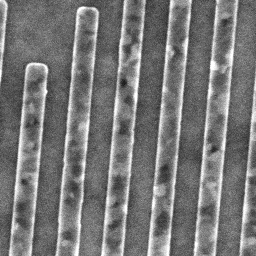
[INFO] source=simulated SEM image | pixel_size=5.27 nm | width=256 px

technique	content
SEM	parallel lines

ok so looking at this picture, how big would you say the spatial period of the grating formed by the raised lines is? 45.9 pixels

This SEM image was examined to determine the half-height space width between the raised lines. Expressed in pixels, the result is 25.2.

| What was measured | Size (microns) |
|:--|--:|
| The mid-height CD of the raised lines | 0.11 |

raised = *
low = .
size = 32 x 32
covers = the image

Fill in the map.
*...............**...***...***..
*.........**...***...***...***..
*.........**...***...***...**...
*.........**...***...***...**...
*........***...***...***...**...
.........***...***...**....**...
.........***...***...**....**...
.........***...**....**...***...
...***...***...**....**...***...
...***...***...**....**...***...
...***...***...**...***...***...
...***...**....**...***...***...
...***...**...***...***...***...
...**....**...***...***...**....
...**....**...***...***...**....
...**...***...***...**....**...*
...**...***...***...**....**...*
..***...***...***...**....**...*
..***...***...***...**...***...*
..***...***...**....**...***...*
..***...***...**....**...***...*
..***...***...**...***...***...*
..***...**....**...***...***...*
..***...**...***...***...***...*
..***...**...***...***...***...*
..**....**...***...***...**....*
..**...***...***...***...**...**
..**...***...***...**....**...**
..**...***...***...**....**...**
.***...***...***...**....**...**
.***...***...**....**...***...**
.***...***...**....**...***...**